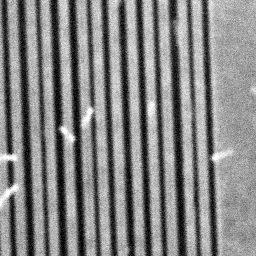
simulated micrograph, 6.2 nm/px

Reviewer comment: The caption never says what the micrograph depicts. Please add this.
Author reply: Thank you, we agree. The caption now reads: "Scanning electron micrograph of parallel lines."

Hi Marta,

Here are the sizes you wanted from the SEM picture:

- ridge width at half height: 48.8 nm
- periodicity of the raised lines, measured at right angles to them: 104 nanometres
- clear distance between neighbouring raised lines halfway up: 9.74 pixels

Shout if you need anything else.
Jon